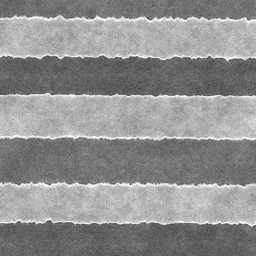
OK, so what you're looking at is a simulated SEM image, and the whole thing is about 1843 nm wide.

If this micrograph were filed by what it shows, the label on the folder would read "lines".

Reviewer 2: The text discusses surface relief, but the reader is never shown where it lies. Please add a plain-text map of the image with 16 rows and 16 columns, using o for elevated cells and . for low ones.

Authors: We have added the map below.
................
oooooooooooooooo
oooooooooooooooo
oooooooooooooooo
................
................
oooooooooooooooo
oooooooooooooooo
oooooooooooooooo
................
................
o...............
oooooooooooooooo
oooooooooooooooo
................
................